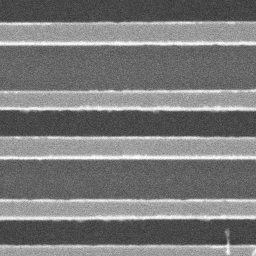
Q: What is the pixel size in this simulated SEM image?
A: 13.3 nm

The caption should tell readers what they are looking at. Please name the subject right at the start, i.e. lines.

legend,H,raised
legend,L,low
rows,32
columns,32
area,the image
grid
LLLLLLLLLLLLLLLLLLLLLLLLLLLLLLLL
LLLLLLLLLLLLLLLLLLLLLLLLLLLLLLLL
LLLLLLLLLLLLLLLLLLLLLLLLLLLLLLLL
HHHHHHHHHHHHHHHHHHHHHHHHHHHHHHHH
HHHHHHHHHHHHHHHHHHHHHHHHHHHHHHHH
HHHHHHHHHHHHHHHHHHHHHHHHHHHHHHHH
LLLLLLLLLLLLLLLLLLLLLLLLLLLLLLLL
LLLLLLLLLLLLLLLLLLLLLLLLLLLLLLLL
LLLLLLLLLLLLLLLLLLLLLLLLLLLLLLLL
LLLLLLLLLLLLLLLLLLLLLLLLLLLLLLLL
LLLLLLLLLLLLLLLLLLLLLLLLLLLLLLLL
HHHHHHHHHHHHHHHHHHHHHHHHHHHHHHHH
HHHHHHHHHHHHHHHHHHHHHHHHHHHHHHHH
HHHHHHHHHHHHHHHHHHHHHHHHHHHHHHHH
LLLLLLLLLLLLLLLLLLLLLLLLLLLLLLLL
LLLLLLLLLLLLLLLLLLLLLLLLLLLLLLLL
LLLLLLLLLLLLLLLLLLLLLLLLLLLLLLLL
HHHHHHHHHHHHHHHHHHHHHHHHHHHHHHHH
HHHHHHHHHHHHHHHHHHHHHHHHHHHHHHHH
HHHHHHHHHHHHHHHHHHHHHHHHHHHHHHHH
LLLLLLLLLLLLLLLLLLLLLLLLLLLLLLLL
LLLLLLLLLLLLLLLLLLLLLLLLLLLLLLLL
LLLLLLLLLLLLLLLLLLLLLLLLLLLLLLLL
LLLLLLLLLLLLLLLLLLLLLLLLLLLLLLLL
LLLLLLLLLLLLLLLLLLLLLLLLLLLLLLLL
HHHHHHHHHHHHHHHHHHHHHHHHHHHHHHHH
HHHHHHHHHHHHHHHHHHHHHHHHHHHHHHHH
LLLLLLLLLLLLLLLLLLLLLLLLLLLLLLLL
LLLLLLLLLLLLLLLLLLLLLLLLLLLLLLLL
LLLLLLLLLLLLLLLLLLLLLLLLLLLLLLLL
LLLLLLLLLLLLLLLLLLLLLLLLLLLLLLLL
HHHHHHHHHHHHHHHHHHHHHHHHHHHHHHHH